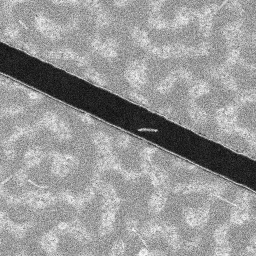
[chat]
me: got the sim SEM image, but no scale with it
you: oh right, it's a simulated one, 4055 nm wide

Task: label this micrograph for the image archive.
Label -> one or a few lines or trenches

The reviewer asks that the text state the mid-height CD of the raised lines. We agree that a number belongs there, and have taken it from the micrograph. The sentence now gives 0.472 µm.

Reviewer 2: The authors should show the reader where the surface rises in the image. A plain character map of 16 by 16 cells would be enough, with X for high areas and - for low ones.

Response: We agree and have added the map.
----------------
----------------
----------------
XX--------------
XXXX------------
--XXXX----------
----XXXXX-------
------XXXXX-----
---------XXXX---
-----------XXXX-
-------------XXX
---------------X
----------------
----------------
----------------
----------------